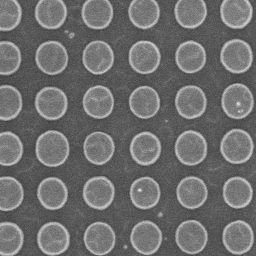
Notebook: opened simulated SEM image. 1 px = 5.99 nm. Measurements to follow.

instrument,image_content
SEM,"a regular array of raised bodies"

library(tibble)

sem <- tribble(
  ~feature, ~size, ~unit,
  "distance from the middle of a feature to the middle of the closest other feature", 268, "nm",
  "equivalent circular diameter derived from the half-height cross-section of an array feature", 188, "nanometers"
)